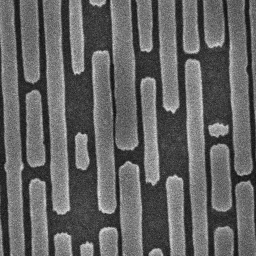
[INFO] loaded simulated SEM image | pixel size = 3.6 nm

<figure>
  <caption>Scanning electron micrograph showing parallel lines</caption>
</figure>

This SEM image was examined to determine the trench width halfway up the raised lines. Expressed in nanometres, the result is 23.4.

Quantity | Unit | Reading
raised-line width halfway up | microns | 0.0607